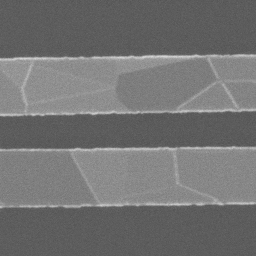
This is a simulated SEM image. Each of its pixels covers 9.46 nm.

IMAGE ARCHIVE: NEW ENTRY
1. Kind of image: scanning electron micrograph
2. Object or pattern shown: lines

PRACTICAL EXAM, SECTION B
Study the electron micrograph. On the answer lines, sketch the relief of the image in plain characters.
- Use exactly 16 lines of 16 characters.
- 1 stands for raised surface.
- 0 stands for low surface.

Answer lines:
0000000000000000
0000000000000000
0000000000000000
0000000000000011
1111111111111111
1111111111111111
1111111111111111
0000000000000000
0000000000000000
1111111111111111
1111111111111111
1111111111111111
1111111111111111
0000000000000000
0000000000000000
0000000000000000